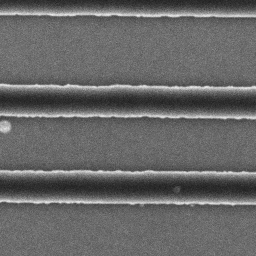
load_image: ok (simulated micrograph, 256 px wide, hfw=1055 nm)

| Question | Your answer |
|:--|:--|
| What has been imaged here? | lines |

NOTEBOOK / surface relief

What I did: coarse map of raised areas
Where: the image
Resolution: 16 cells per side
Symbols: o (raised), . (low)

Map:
oooooooooooooooo
................
................
................
................
oooooooooooooooo
oooooooooooooooo
................
................
................
................
oooooooooooooooo
oooooooooooooooo
................
................
................